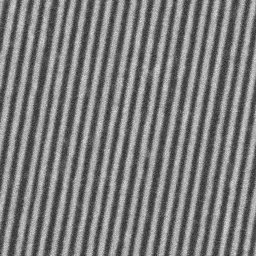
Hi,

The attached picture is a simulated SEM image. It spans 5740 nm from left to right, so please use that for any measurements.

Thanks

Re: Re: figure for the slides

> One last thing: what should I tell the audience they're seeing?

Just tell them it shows parallel lines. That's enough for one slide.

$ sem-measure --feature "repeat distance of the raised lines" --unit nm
266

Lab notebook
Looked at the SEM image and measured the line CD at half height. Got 91.1 nanometres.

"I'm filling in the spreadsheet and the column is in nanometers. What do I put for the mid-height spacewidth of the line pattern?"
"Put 185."